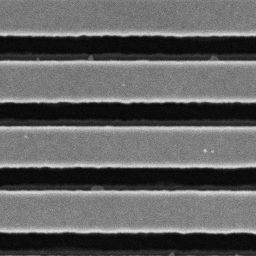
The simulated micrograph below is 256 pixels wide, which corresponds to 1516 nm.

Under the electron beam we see lines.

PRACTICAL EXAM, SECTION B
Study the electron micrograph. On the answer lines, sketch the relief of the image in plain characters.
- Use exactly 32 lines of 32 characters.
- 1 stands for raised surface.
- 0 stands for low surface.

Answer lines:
11111111111111111111111111111111
11111111111111111111111111111111
11111111111111111111111111111111
11111111111111111111111111111111
11111111110110011100111111111111
00000000000000000000000000000000
00000000000000000000000000000000
11111111111111111111111111111111
11111111111111111111111111111111
11111111111111111111111111111111
11111111111111111111111111111111
11111111111111111111111111111111
11111111111111111111111111111111
00000000000000000000000000000000
00000000000000000000000000000000
11111111111111111111111111111111
11111111111111111111111111111111
11111111111111111111111111111111
11111111111111111111111111111111
11111111111111111111111111111111
11111111111111111111111111111111
00000000000000000000000000000000
00000000000000000000000000000000
11111111111111111111111111111111
11111111111111111111111111111111
11111111111111111111111111111111
11111111111111111111111111111111
11111111111111111111111111111111
11111111111111111111111111111111
00000000000000000000000000000000
00000000000000000000000000000000
11111111111111111111111100100111